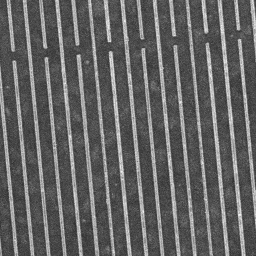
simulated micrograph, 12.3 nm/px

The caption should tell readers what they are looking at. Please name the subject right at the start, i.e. parallel lines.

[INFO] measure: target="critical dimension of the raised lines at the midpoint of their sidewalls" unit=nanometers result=32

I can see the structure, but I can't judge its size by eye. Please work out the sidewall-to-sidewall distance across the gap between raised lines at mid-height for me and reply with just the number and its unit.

174 nm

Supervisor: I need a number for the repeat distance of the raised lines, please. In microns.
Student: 0.198